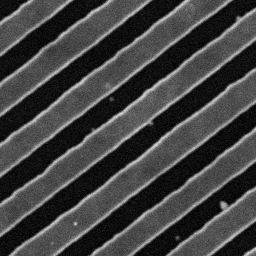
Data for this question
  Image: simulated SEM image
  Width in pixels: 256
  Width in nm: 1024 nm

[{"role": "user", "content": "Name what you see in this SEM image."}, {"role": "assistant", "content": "lines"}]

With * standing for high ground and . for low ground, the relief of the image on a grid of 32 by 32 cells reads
...*****.....*****.....*****....
..*****....******....******....*
******....******....******....**
*****....******....*****.....***
***....******.....*****....*****
**....******....******....*****.
*....******....*****.....*****..
....*****.....*****....******...
..******....******....*****.....
.******....******....*****.....*
*****.....*****....******....***
****....******....******....****
***....******....*****.....*****
*.....*****.....*****....******.
.....*****....******....******..
...******....*****....*******...
..*****.....*****....******....*
.*****....******....******....**
*****....******....******....***
***.....*****.....*****....*****
**....******....******....******
*....******....******....*****..
....*****.....*****.....*****...
...*****....******....******....
.******....******....*****....**
*****.....*****.....*****....***
****....******....******....****
***....******....*****....******
*.....*****.....*****....******.
....******....******....*****...
...******....*****....******....
..******....*****....******....*